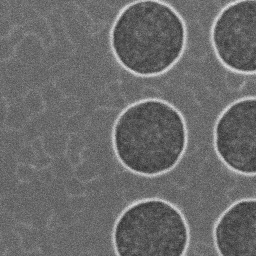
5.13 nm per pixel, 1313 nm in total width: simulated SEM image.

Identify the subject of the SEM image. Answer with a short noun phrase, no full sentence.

holes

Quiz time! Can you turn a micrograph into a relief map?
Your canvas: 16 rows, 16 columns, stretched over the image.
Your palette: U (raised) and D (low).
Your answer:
UUUUUUUUDDDUUUDD
UUUUUUUDDDDUUDDD
UUUUUUUDDDDUUDDD
UUUUUUUDDDDUUUDD
UUUUUUUUDDUUUUUU
UUUUUUUUUUUUUUUU
UUUUUUUUUDUUUUUD
UUUUUUUDDDDUUUDD
UUUUUUUDDDDDUUDD
UUUUUUUDDDDUUUDD
UUUUUUUUDDDUUUUD
UUUUUUUUUUUUUUUU
UUUUUUUUUUUUUUUU
UUUUUUUUDDDUUUDD
UUUUUUUDDDDDUUDD
UUUUUUUDDDDDUUDD